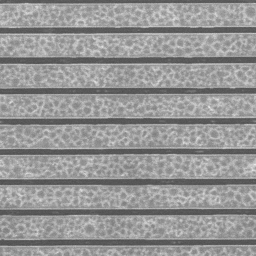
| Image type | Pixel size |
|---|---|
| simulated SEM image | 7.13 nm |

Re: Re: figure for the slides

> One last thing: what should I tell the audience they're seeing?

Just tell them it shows parallel lines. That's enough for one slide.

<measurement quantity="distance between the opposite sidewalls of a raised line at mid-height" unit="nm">169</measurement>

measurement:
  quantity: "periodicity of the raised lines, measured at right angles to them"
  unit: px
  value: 30.2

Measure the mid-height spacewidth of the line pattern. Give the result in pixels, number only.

7